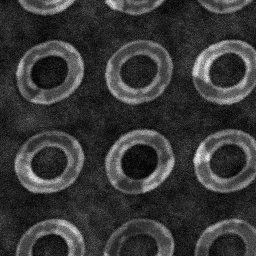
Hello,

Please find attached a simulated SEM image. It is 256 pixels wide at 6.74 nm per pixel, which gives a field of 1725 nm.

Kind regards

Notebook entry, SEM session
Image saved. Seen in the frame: ring-shaped raised bodies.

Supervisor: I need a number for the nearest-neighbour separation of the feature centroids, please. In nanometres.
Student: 599